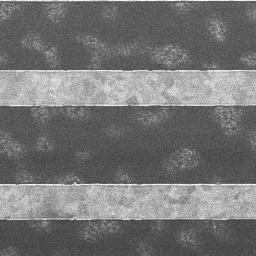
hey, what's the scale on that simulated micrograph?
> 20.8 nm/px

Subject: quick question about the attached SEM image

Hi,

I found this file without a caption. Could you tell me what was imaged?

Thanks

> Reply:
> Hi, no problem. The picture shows one or a few lines or trenches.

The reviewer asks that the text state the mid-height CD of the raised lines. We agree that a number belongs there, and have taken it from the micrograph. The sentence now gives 715 nm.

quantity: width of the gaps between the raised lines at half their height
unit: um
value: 1.55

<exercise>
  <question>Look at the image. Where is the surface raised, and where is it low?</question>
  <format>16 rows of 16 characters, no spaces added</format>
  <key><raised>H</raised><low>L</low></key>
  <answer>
LLLLLLLLLLLLLLLL
LLLLLLLLLLLLLLLL
LLLLLLLLLLLLLLLL
LLLLLLLLLLLLLLLL
HHHHHHHHHHHHHHHH
HHHHHHHHHHHHHHHH
HHHHHHHHHHHHHHHH
LLLLLLLLLLLLLLLL
LLLLLLLLLLLLLLLL
LLLLLLLLLLLLLLLL
LLLLLLLLLLLLLLLL
LLLLLLLLLLLLLLLL
HHHHHHHHHHHHHHHH
HHHHHHHHHHHHHHHH
LLLLLLLLLLLLLLLL
LLLLLLLLLLLLLLLL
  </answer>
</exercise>